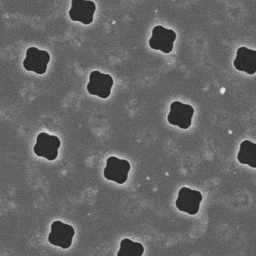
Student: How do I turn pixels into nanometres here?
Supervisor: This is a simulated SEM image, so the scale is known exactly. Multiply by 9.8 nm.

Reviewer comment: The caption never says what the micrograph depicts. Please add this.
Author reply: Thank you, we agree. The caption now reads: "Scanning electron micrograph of a regular array of holes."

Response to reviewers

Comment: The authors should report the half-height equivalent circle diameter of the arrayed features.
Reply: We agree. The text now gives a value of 258 nm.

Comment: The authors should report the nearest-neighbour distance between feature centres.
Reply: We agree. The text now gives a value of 740 nm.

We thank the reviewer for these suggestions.